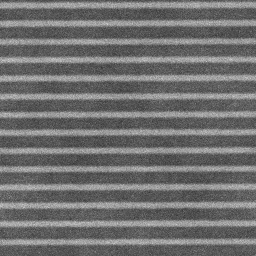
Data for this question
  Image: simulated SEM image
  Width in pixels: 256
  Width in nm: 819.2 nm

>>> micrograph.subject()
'parallel lines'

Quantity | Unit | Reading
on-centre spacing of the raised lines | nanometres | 58.2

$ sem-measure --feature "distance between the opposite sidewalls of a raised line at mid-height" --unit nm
14.4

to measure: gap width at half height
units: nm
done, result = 43.2